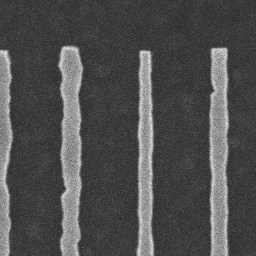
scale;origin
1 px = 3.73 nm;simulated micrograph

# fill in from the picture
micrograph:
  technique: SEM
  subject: one or a few lines or trenches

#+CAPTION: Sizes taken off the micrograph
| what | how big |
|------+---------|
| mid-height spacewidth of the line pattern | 221 nm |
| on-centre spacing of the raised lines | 276 nanometres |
